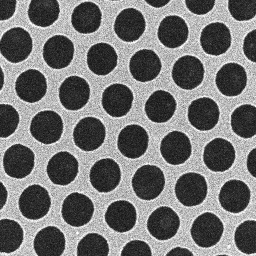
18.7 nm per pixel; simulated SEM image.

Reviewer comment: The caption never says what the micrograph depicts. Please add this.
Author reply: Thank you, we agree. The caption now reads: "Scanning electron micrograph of a regular array of holes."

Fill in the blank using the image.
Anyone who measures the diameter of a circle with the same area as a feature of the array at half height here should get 619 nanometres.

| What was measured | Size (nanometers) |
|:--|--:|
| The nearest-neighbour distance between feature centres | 814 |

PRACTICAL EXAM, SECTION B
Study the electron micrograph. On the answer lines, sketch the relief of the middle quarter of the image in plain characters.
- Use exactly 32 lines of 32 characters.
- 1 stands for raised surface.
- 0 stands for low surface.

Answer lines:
01111100000001110000000011100000
11111100000011110000000011100000
11111111000111111000000011100000
10000111111111111000000111100000
00000011111111111110011111110000
00000011111000001111111111110000
00000001110000000111111001111100
00000001110000000111110000011111
00000011100000000111100000001111
00000011100000000111000000001111
00000111100000000111000000001110
10001111110000000111000000001110
11111111111000001111000000001110
11111000111111111111100000011110
11110000011111111111110001111110
11100000001111100001111111111111
11000000000111000000111111111111
11000000000111000000011111000011
11000000001110000000011110000001
11100000001110000000011100000000
11100000011110000000011100000000
11111000111111000000011100000000
00111111111111000000111100000000
00011111110011110001111110000001
00011111000001111111111111000011
00001110000000111110000111111111
00001100000000111100000011111111
00011100000000111100000001111100
00011100000000111000000001111000
00111100000000111000000001110000
11111110000001111000000001110000
11111111000011111000000001110000